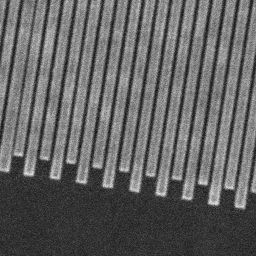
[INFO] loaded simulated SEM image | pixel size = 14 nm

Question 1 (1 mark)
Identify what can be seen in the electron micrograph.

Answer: parallel lines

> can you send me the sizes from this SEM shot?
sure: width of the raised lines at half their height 0.119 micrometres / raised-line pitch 186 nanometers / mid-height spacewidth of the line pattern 65.6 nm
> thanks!